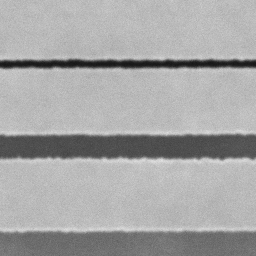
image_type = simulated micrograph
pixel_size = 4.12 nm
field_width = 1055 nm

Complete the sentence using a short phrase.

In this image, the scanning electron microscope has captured lines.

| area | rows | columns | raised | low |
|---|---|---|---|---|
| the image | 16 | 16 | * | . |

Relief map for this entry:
****************
****************
****************
****************
****************
****************
****************
****************
................
................
****************
****************
****************
****************
................
................